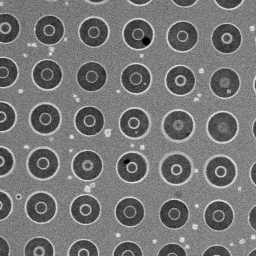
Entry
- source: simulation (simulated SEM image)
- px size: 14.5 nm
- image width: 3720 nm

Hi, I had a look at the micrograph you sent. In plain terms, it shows an array of small figures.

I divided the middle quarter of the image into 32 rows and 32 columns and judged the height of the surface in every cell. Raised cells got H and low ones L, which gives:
HHHHLLLLLLHHHHHHLLLLHHHHHHHHLLHH
HHHHLLLLLLHHHHHLLLLLLHHHHHLLLLLL
HHHLLLHHLLLHHHLLLHHLLLHHHHLLLLLL
HHHLLLHHLLLHHHLLLHHLLLHHHLLLHHLL
HHHLLLLLLLHHHHLLLHHLLLHHHLLLHHLL
HHHHLLLLLLHHHHHLLLLLLHHHHHLLLLLL
HHHHHLLLHHHHHHHHLLLLLHHHHHLLLLLL
HHHHHHHHHHHHHHHHHHHHHHHHHHHHLLLH
HHHHHHHHHHHHHHHHHHHHHHHHHHHHHHHH
HHHHHHHHHHHHHHHHHHHHHHHHHHHHHHHH
HHHHHHHHHHHHHHHHHHHHHHHHHHHHHHHH
HHHHLLLLLHHHHHHHLLLHHHHHHHHHHHHH
HHHLLLLLLLHHHHHLLLLLLHHHHHLLLLLH
HHHLLHHHLLHHHHLLLHLLLHHHHLLLLLLL
HHHLLHHHLLHHHHLLHHHLLHHHHLLLHLLL
HHHLLLHLLLHHHHLLHHHLLHHHHLLLHHLL
HHHLLLLLLHHHHHLLLLLLLHHHHLLLLLLL
HHHHHLLLHHHHHHHLLLLLHHHHHLLLLLLL
HHHHHHHHHHHHHHHHHLHHHHHHHHLLLLLH
HHHHHHHHHHHHHHHHHHHHHHHHHHHHHHHH
HHHHHHHHHHHHHHHHHHHHHHHHHHHHHHHH
HHHHHHHHHHHHHHHHHHHHHHHHHHHHHHHH
HHHLLLLLHHHHHHHLLLLHHHHHHHHLLHHH
HHHLLLLLLHHHHHLLLLLLHHHHHLLLLLLH
HHLLLHHLLLHHHLLLLLLLLHHHHLLLLLLL
HHLLLHHLLLHHHLLLHHLLLHHHLLLHHLLL
HHLLLHLLLHHHHLLLHHLLLHHHLLLHHLLL
HHHLLLLLLHHHHHLLLLLLHHHHLLLHHLLL
HHHHLLLLHHHHHHLLLLLLHHHHHLLLLLLH
HHHHHHHHHHHHHHHHLLHHHHHHHHLLLLHH
HHHHHHHHHHHHHHHHHHHHHHHHHHHHHHHH
HHHHHHHHHHHHHHHHHHHHHHHHHHHHHHHH